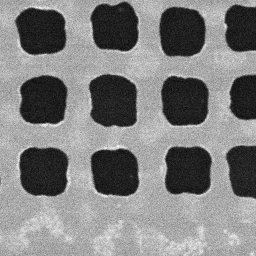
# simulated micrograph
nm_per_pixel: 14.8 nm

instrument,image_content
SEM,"a regular array of holes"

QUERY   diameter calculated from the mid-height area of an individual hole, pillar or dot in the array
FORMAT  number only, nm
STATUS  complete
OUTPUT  754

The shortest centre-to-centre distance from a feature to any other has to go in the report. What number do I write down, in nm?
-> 1020